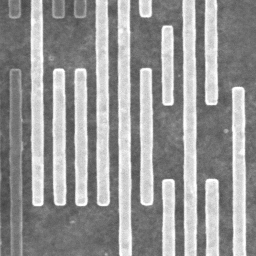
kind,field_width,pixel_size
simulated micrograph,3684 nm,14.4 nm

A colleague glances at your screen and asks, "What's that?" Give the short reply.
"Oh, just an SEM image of wiring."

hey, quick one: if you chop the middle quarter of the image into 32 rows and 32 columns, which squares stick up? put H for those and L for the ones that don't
LLLLLLLLHHHLLLHHLLLLLLLLLHHLLLHH
LLLHHLLLHHHLLLHHLLLHHHLLLHHLLLHH
LLLHHHLLHHHLLLHHLLLHHHLLLHHLLLHH
LLLHHHLLHHHLLLHHLLLHHHLLLHHLLLHH
LLLHHHLLHHHLLLHHLLLHHHLLLHHLLLHH
LLLHHHLLHHHLLLHHLLLHHHLLLHHLLLHH
LLLHHHLLHHHLLLHHLLLHHHLLLHHLLLHH
LLLHHHLLHHHLLLHHLLLHHHLLLHHLLLHH
LLLHHHLLHHHLLLHHLLLHHHLLLHHLLLHH
LLLHHHLLHHHLLLHHLLLHHHLLLHHLLLHH
LLLHHHLLHHHLLLHHLLLHHHLLLLLLLLHH
LLLHHHLLHHHLLLHHLLLHHHLLLLLLLLHH
LLLHHHLLHHHLLLHHLLLHHHLLLLLLLLHH
LLLHHHLLHHHLLLHHLLLHHHLLLLLLLLHH
LLLHHHLLHHHLLLHHLLLHHHLLLLLLLLHH
LLLHHHLLHHHLLLHHLLLHHHLLLLLLLLHH
LLLHHHLLHHHLLLHHLLLHHHLLLLLLLLHH
LLLHHHLLHHHLLLHHLLLHHHLLLLLLLLHH
LLLHHHLLHHHLLLHHLLLHHHLLLLLLLLHH
LLLHHHLLHHHLLLHHLLLHHHLLLLLLLLHH
LLLHHHLLHHHLLLHHLLLHHHLLLLLLLLHH
LLLHHHLLHHHLLLHHLLLHHHLLLLLLLLHH
LLLHHHLLHHHLLLHHLLLHHHLLLLLLLLHH
LLLHHHLLHHHLLLHHLLLHHHLLLLLLLLHH
LLLHHHLLHHHLLLHHHLLHHHLLLLLLLLHH
LLLHHHLLHHHLLLHHHLLHHHLLLLLLLLHH
LLLHHHLLHHHLLLHHHLLHHHLLLLLLLLHH
LLLHHHLLHHHLLLHHHLLHHHLLLLLLLLHH
LLLHHHLLHHHLLLHHHLLHHHLLLLLLLLHH
LLLHHHLLHHHLLLHHHLLHHHLLLHHLLLHH
LLLHHHLLHHHLLLHHHLLHHHLLLHHLLLHH
LLLHHHLLHHHLLLHHHLLHHHLLLHHLLLHH